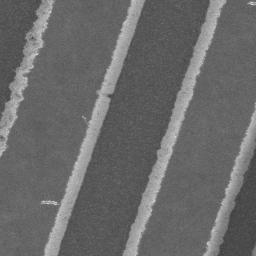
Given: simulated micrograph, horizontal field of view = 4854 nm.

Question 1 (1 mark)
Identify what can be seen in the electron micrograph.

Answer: one or a few lines or trenches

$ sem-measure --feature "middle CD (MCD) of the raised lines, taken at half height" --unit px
82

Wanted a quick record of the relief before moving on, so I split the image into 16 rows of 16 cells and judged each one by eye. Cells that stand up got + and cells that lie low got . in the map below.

...++++++....+++
..++++++.....+++
..++++++.....+++
..+++++.....++++
.++++++.....++++
.++++++.....++++
.+++++.....+++++
++++++.....+++++
++++++.....+++++
+++++.....+++++.
+++++.....+++++.
+++++.....+++++.
++++.....+++++..
++++.....+++++..
++++.....+++++..
+++.....+++++...